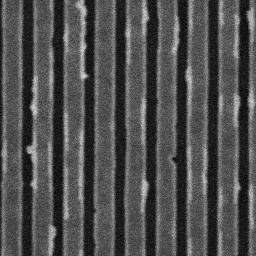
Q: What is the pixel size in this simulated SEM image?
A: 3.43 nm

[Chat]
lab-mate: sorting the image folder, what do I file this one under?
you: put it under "parallel lines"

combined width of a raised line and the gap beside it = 106 nanometers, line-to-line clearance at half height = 42 nanometres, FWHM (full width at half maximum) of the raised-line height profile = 63 nm